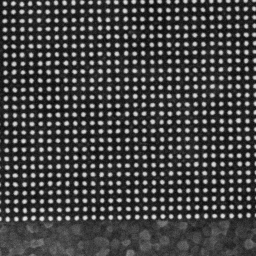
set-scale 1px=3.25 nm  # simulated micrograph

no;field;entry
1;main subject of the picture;a regular array of raised bodies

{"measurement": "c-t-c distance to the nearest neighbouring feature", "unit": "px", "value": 8.25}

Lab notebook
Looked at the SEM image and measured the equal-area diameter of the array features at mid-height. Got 14.7 nm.